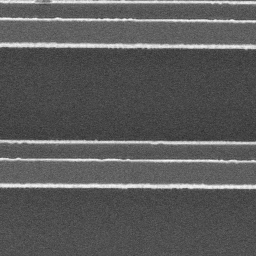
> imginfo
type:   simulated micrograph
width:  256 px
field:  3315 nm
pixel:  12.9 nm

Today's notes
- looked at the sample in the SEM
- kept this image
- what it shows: lines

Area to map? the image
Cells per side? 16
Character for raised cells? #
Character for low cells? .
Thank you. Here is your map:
################
################
################
................
................
................
................
................
................
################
################
################
................
................
................
................